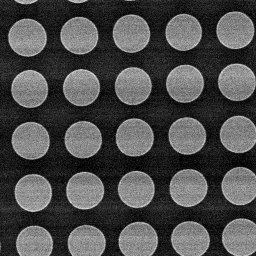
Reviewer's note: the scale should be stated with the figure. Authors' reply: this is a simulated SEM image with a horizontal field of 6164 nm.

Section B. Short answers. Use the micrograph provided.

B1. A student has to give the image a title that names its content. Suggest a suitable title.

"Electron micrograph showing an array of small figures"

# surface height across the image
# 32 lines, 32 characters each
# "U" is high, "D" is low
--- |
DDDDDDDDDDDDDDDDDDDDDDDDDDDDDDDD
DDDDDDDDDDDDDDDDDDDDDDDDDDDDDUDD
DDDUDDDDDUUDDDDUUUDDDUUUUDDDUUUD
DUUUUDDDUUUUDDUUUUUDDUUUUDDUUUUU
DUUUUUDDUUUUDDUUUUUDDUUUUDDUUUUU
DUUUUUDDUUUUDDDUUUDDDUUUUDDDUUUD
DDUUUDDDDUUDDDDDUDDDDDDDDDDDDDDD
DDDDDDDDDDDDDDDDDDDDDDDDDDDDDDDD
DDDDDDDDDDDDDDDDDDDDDDUUDDDDUUUD
DDUUUDDDUUUUDDDUUUUDDUUUUDDUUUUU
DDUUUUDDUUUUDDUUUUUDDUUUUDDUUUUU
DUUUUUDDUUUUDDDUUUUDDUUUUDDDUUUU
DDUUUUDDDUUUDDDUUUDDDDUUDDDDDUDD
DDDDDDDDDDDDDDDDDDDDDDDDDDDDDDDD
DDDDDDDDDDDDDDDDDDDDDDDDDDDDDDDD
DDDUUDDDDUUUDDDUUUDDDDUUUDDDUUUU
DDUUUUDDUUUUDDDUUUUDDUUUUUDDUUUU
DDUUUUDDUUUUUDDUUUUDDUUUUUDDUUUU
DDUUUUDDUUUUDDDUUUUDDDUUUDDDUUUD
DDDUUDDDDUUDDDDDDDDDDDDDDDDDDDDD
DDDDDDDDDDDDDDDDDDDDDDDDDDDDDDDD
DDDDDDDDDDDDDDDDUUDDDDUUUDDDDUUD
DDDUUUDDDUUUDDDUUUUDDUUUUUDDUUUU
DDUUUUDDUUUUUDDUUUUDDUUUUUDDUUUU
DDUUUUDDUUUUUDDUUUUDDUUUUUDDUUUU
DDUUUUDDDUUUDDDDUUDDDDUUUDDDDUUD
DDDDDDDDDDDDDDDDDDDDDDDDDDDDDDDD
DDDDDDDDDDDDDDDDDDDDDDDDDDDDDUUD
DDDUUDDDDDUUDDDDUUUDDDUUUDDDUUUU
DDUUUUDDDUUUUDDUUUUUDUUUUUDDUUUU
DDUUUUDDDUUUUDDUUUUUDDUUUUDDUUUU
DDUUUUDDDUUUUDDUUUUDDDUUUUDDDUUU